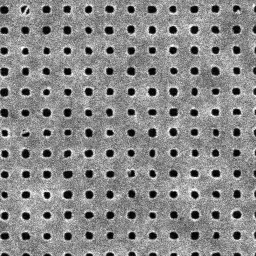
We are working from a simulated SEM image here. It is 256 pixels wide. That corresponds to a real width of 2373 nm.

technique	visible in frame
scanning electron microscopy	a regular array of holes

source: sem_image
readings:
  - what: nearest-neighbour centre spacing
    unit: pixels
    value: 20.4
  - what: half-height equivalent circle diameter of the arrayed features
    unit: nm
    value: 74.7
